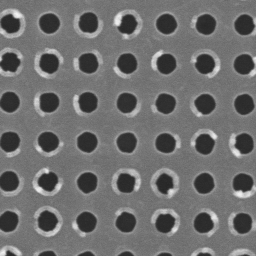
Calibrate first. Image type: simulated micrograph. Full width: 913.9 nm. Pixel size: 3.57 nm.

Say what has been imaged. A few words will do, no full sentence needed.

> a regular array of holes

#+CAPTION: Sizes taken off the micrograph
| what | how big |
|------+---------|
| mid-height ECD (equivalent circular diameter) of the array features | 74 nm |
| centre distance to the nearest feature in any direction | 0.138 micrometres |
